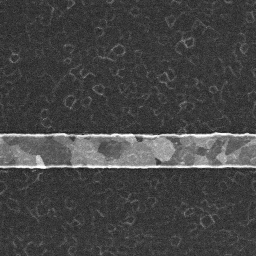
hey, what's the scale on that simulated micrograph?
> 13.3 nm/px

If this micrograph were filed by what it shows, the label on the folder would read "one or a few lines or trenches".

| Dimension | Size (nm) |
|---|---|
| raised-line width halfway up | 420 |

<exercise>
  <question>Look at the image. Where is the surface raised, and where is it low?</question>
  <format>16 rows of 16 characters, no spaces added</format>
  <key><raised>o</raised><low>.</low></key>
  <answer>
................
................
................
................
................
................
................
................
ooooooooo.oooooo
oooooooooooooooo
................
................
................
................
................
................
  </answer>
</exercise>